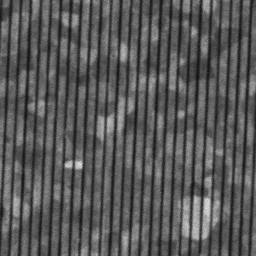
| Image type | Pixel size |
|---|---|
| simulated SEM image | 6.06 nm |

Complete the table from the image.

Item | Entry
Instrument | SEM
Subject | parallel lines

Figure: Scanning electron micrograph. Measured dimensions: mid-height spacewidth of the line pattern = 17.4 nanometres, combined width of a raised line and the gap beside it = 60.7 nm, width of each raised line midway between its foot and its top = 0.0401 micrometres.